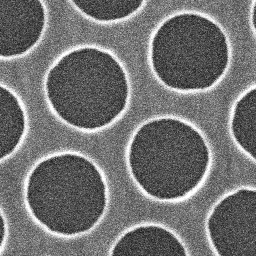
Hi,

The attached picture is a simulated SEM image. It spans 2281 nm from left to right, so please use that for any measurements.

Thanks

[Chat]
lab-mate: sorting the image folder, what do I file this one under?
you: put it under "holes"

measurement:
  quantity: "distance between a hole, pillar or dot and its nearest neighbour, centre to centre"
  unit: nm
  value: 955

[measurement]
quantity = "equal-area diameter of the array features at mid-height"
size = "718 nm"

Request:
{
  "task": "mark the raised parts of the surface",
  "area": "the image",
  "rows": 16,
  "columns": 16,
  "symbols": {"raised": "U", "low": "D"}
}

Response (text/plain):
DDDUUDDDDUUUUUUU
DDDUUUUUUUDDDUUU
DDUUUUUUUUDDDDUU
DUUUDDDUUDDDDDUU
UUUDDDDDUUDDDDUU
UUUDDDDDUUUDDUUU
DUUDDDDDUUUUUUUD
DDUUDDDUUUDUUUUD
DUUUUUUUDDDDDUUD
DUUUUUUUDDDDDUUD
UUDDDDUUDDDDDUUU
UUDDDDDUUDDDUUUU
UUDDDDDUUUUUUUDD
UUDDDDUUUUUUUDDD
UUUDDUUUDDDUUDDD
UUUUUUUDDDDUUDDD